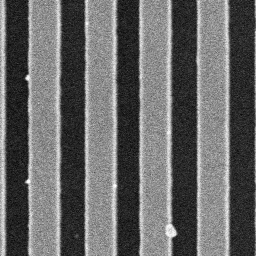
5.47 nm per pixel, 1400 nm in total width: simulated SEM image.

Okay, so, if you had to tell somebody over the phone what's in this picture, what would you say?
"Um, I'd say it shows lines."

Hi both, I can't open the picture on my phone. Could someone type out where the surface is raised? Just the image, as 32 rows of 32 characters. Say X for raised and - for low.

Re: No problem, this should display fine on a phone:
X---XXX----XXXX--XXXX----XXX----
X---XXX----XXXX--XXXX----XXXX---
X---XXX----XXXX--XXXX----XXXX---
X---XXX----XXXX--XXXX----XXXX---
X---XXX----XXXX--XXXX----XXXX---
X---XXX----XXXX--XXXX----XXXX---
X---XXX----XXXX--XXXX----XXXX---
X---XXX----XXXX--XXXX----XXXX---
X---XXX----XXXX--XXXX----XXXX---
X--XXXX----XXXX--XXXX----XXXX---
X---XXX----XXXX--XXXX----XXXX---
X---XXX----XXXX--XXXX----XXXX---
X---XXX----XXXX--XXXX----XXXX---
X---XXX----XXXX--XXXX----XXXX---
X---XXX----XXXX--XXXX----XXXX---
X---XXX----XXXX--XXXX----XXXX---
X---XXX----XXXX--XXXX----XXXX---
X---XXX----XXXX--XXXX----XXXX---
X---XXX----XXXX--XXXX----XXXX---
X---XXX----XXXX--XXXX----XXXX---
X---XXX----XXXX--XXXX----XXXX---
X---XXX----XXXX--XXXX----XXXX---
X--XXXX----XXXX--XXXX----XXXX---
X---XXX----XXXX--XXXX----XXXX---
X---XXX----XXXX--XXXX----XXXX---
X---XXX----XXXX--XXXX----XXXX---
X---XXX----XXXX--XXXX----XXXX---
X---XXX----XXXX--XXXX----XXXX---
X---XXX----XXXX--XXXXX---XXXX---
X---XXX----XXXX---XXXX---XXXX---
X---XXX----XXXX--XXXX----XXXX---
X---XXX----XXXX--XXXX----XXXX---